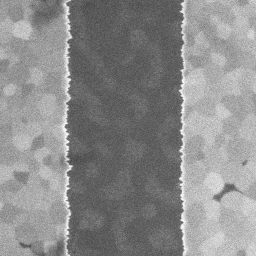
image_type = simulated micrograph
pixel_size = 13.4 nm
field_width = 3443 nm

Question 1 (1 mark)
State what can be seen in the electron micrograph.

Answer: one or a few lines or trenches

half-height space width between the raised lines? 1550 nanometers